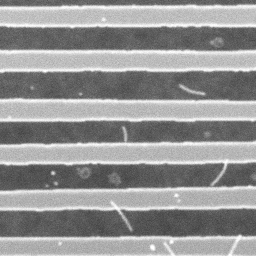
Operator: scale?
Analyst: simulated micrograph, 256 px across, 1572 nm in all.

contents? lines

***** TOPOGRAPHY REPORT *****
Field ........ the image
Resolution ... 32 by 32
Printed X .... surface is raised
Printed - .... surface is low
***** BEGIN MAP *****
--------------------------------
XXXXXXXXXXXXXXXXXXXXXXXXXXXXXXXX
XXXXXXXXXXXXXXXXXXXXXXXXXXXXXXXX
--------------------------------
--------------------------------
--------------------------------
XXXXXXXXXXXXXXXXXXXXXXXXXXXXXXXX
XXXXXXXXXXXXXXXXXXXXXXXXXXXXXXXX
XXXXXXXXXXXXXXXXXXXXXXXXXXXXXXXX
--------------------------------
--------------------------------
--------------------------------
XXXXXXXXXXXXXX------------------
XXXXXXXXXXXXXXXXXXXXXXXXXXXXXXXX
XXXXXXXXXXXXXXXXXXXXXXXXXXXXXXXX
--------------------------------
--------------------------------
--------------------------------
XXXXXXXXXXXXXXXXXXXXXXXXXXXXXXXX
XXXXXXXXXXXXXXXXXXXXXXXXXXXXXXXX
XXXX----X-----------------------
--------------------------------
--------------------------------
----------------------XXXXXXXXXX
XXXXXXXXXXXXXXXXXXXXXXXXXXXXXXXX
XXXXXXXXXXXXXXXXXXXXXXXXXXXXXXXX
--------------------------------
--------------------------------
--------------------------------
-----------------------------X--
XXXXXXXXXXXXXXXXXXXXXXXXXXXXXXXX
XXXXXXXXXXXXXXXXXXXXXXXXXXXXXXXX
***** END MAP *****